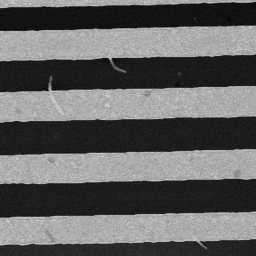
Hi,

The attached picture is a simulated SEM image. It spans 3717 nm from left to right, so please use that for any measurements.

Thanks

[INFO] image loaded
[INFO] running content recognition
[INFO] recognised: lines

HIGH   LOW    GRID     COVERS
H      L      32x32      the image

HHHHHHHHHHHHHHHHHHHHLLLLLLLLLLLL
LLLLLLLLLLLLLLLLLLLLLLLLLLLLLLLL
LLLLLLLLLLLLLLLLLLLLLLLLLLLLLLLL
LLLLLLLLLLLLLLLLLLLLLLHHHHHHHHHH
HHHHHHHHHHHHHHHHHHHHHHHHHHHHHHHH
HHHHHHHHHHHHHHHHHHHHHHHHHHHHHHHH
HHHHHHHHHHHHHHHHHHHHHHHHHHHHHHHH
HHLLLLLLLLLLLLLLLLLLLLLLLLLLLLLL
LLLLLLLLLLLLLLLLLLLLLLLLLLLLLLLL
LLLLLLLLLLLLLLLLLLLLLLLLLLLLLLLL
LLLLLLLLLLLLLLLLLLLLLLLLLLLLLLLL
LLLLLHHHHHHHHHHHHHHHHHHHHHHHHHHH
HHHHHHHHHHHHHHHHHHHHHHHHHHHHHHHH
HHHHHHHHHHHHHHHHHHHHHHHHHHHHHHHH
HHHHHHHHHHHHHHHHHHHHHHHHHHHHHHLL
LLLLLLLLLLLLLLLLLLLLLLLLLLLLLLLL
LLLLLLLLLLLLLLLLLLLLLLLLLLLLLLLL
LLLLLLLLLLLLLLLLLLLLLLLLLLLLLLLL
LLLLLLLLLLLLLLLLLLLLLLLLLLLLLLLL
LLHHHHHHHHHHHHHHHHHHHHHHHHHHHHHH
HHHHHHHHHHHHHHHHHHHHHHHHHHHHHHHH
HHHHHHHHHHHHHHHHHHHHHHHHHHHHHHHH
HHHHHHHHHHHHHHHHHHHHHLLLLLLLLLLL
LLLLLLLLLLLLLLLLLLLLLLLLLLLLLLLL
LLLLLLLLLLLLLLLLLLLLLLLLLLLLLLLL
LLLLLLLLLLLLLLLLLLLLLLLLLLLLLLLL
LLLLLLLLLLLLLLLLLLLLLLLLLLLLLLLL
HHHHHHHHHHHHHHHHHHHHHHHHHHHHHHHH
HHHHHHHHHHHHHHHHHHHHHHHHHHHHHHHH
HHHHHHHHHHHHHHHHHHHHHHHHHHHHHHHH
HLHHLLLLLLLLLLLLLLLLLLLLLLLLLLLL
LLLLLLLLLLLLLLLLLLLLLLLLLLLLLLLL